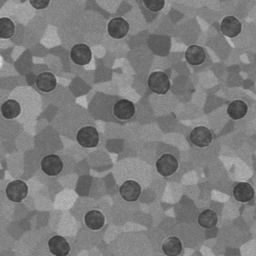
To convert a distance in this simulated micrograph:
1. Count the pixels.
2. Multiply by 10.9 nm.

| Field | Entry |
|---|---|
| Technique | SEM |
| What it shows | a regular array of holes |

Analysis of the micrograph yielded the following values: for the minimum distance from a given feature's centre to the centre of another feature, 489 nanometres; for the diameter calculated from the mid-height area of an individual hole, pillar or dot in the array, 21.8 pixels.